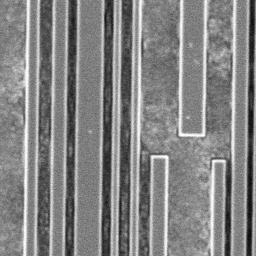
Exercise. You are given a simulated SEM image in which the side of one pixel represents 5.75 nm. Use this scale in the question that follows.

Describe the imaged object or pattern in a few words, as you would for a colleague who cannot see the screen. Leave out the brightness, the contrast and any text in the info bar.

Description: groups of lines, slits or small figures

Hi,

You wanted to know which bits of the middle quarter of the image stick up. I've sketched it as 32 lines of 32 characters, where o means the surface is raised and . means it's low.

o..ooooooo..oo...oo..........ooo
o..ooooooo..oo...oo..........ooo
o..ooooooo..oo...oo..........ooo
o..ooooooo..oo...oo..........ooo
o..ooooooo..oo...oo..........ooo
o..ooooooo..oo...oo..........ooo
o..ooooooo..oo...oo..........ooo
o..oooooo...oo...oo..........ooo
o..oooooo...oo...oo..........ooo
o..oooooo...oo...oo..........ooo
o..oooooo...oo...oo..........ooo
o..oooooo...oo...oo..........ooo
...oooooo...oo...oo..........ooo
...oooooo...oo...oo..........ooo
...oooooo...oo...oo..........ooo
...oooooo...oo...oo..........ooo
...oooooo...oo...oo..........ooo
...oooooo...oo...oo..........ooo
...oooooo...oo...oo.............
...oooooo...oo...oo.............
...oooooo...oo...oo.............
...oooooo...oo...oo.............
...oooooo...oo...oo.............
...oooooo...oo...oo...oooo......
...oooooo...oo...oo...oooo......
...oooooo...oo...oo...oooo......
...oooooo...oo...oo...oooo......
...oooooo...oo...oo...oooo......
...oooooo...oo...oo...oooo......
...oooooo...oo...oo...oooo......
...oooooo...oo...oo...oooo......
...oooooo...o....oo...oooo......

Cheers